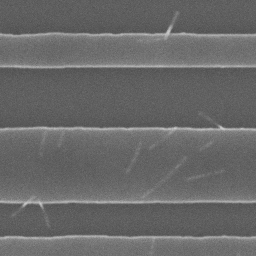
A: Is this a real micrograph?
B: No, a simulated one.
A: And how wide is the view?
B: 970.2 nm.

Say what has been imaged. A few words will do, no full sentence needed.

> lines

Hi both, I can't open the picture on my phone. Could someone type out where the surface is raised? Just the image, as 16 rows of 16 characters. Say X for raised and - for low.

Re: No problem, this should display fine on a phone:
----------------
----------------
XXXXXXXXXXXXXXXX
XXXXXXXXXXXXXXXX
----------------
----------------
----------------
----------------
XXXXXXXXXXXXXXXX
XXXXXXXXXXXXXXXX
XXXXXXXXXXXXXXXX
XXXXXXXXXXXXXXXX
XXXXXXXXXXXXXXXX
----------------
----------------
XXXXXXXXXXXXXXXX